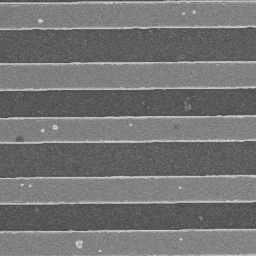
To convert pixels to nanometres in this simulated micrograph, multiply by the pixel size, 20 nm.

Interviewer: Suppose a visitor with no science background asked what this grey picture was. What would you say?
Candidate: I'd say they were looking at lines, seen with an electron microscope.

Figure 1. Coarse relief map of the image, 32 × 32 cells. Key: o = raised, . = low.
oooooooooooooooooooooooooooooooo
oooooooooooooooooooooooooooooooo
oooooooooooooooooooooooooooooooo
ooooooooooooooooooo.............
................................
................................
................................
................................
oooooooooooooooooooooooooooooooo
oooooooooooooooooooooooooooooooo
oooooooooooooooooooooooooooooooo
................................
................................
................................
...........................ooooo
oooooooooooooooooooooooooooooooo
oooooooooooooooooooooooooooooooo
oooooooooooooooooooooooooooooooo
................................
................................
................................
................................
oooooooooooooooooooooooooooooooo
oooooooooooooooooooooooooooooooo
oooooooooooooooooooooooooooooooo
oooooooo........................
................................
................................
................................
oooooooooooooooooooooooooooooooo
oooooooooooooooooooooooooooooooo
oooooooooooooooooooooooooooooooo